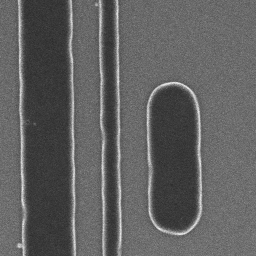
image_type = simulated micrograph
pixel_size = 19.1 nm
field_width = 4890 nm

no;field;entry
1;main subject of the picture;groups of lines, slits or small figures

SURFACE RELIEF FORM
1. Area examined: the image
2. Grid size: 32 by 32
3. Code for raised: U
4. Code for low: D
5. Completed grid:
DDUUUUUUUDDDUUUDDDDDDDDDDDDDDDDD
DDUUUUUUUDDDDUUDDDDDDDDDDDDDDDDD
DDUUUUUUUDDDDUUDDDDDDDDDDDDDDDDD
DDUUUUUUUDDDDUUDDDDDDDDDDDDDDDDD
DDUUUUUUUDDDDUUDDDDDDDDDDDDDDDDD
DDUUUUUUUDDDDUUDDDDDDDDDDDDDDDDD
DDUUUUUUUDDDDUUDDDDDDDDDDDDDDDDD
DDUUUUUUUDDDDUUDDDDDDDDDDDDDDDDD
DDUUUUUUUDDDDUUDDDDDDDDDDDDDDDDD
DDUUUUUUUDDDDUUDDDDDDDDDDDDDDDDD
DDDUUUUUUDDDDUUDDDDDDUUDDDDDDDDD
DDDUUUUUUDDDDUUDDDDUUUUUDDDDDDDD
DDDUUUUUUDDDDUUDDDDUUUUUDDDDDDDD
DDDUUUUUUDDDDUUDDDUUUUUUUDDDDDDD
DDDUUUUUUDDDDUUDDDUUUUUUUDDDDDDD
DDDUUUUUUDDDDUUDDDUUUUUUUDDDDDDD
DDDUUUUUUDDDDUUDDDUUUUUUUDDDDDDD
DDDUUUUUUDDDDUUDDDUUUUUUUDDDDDDD
DDDUUUUUUDDDDUUDDDDUUUUUUDDDDDDD
DDDUUUUUUDDDDUUDDDDUUUUUUDDDDDDD
DDDUUUUUUDDDDUUDDDDUUUUUUDDDDDDD
DDDUUUUUUDDDDUUDDDDUUUUUUDDDDDDD
DDDUUUUUUDDDDUUDDDDUUUUUUDDDDDDD
DDDUUUUUUDDDDUUDDDDUUUUUUDDDDDDD
DDDUUUUUUDDDDUUDDDDUUUUUUDDDDDDD
DDDUUUUUUDDDDUUDDDDUUUUUUDDDDDDD
DDDUUUUUUDDDDUUDDDDUUUUUUDDDDDDD
DDDUUUUUUDDDDUUDDDDUUUUUUDDDDDDD
DDDUUUUUUDDDDUUDDDDDUUUUDDDDDDDD
DDDUUUUUUDDDDUUDDDDDDDDDDDDDDDDD
DDDUUUUUUDDDDUUDDDDDDDDDDDDDDDDD
DDDUUUUUUDDDDUUDDDDDDDDDDDDDDDDD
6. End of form